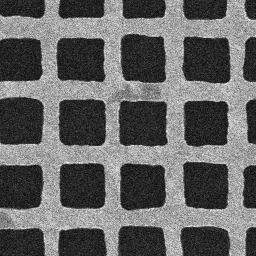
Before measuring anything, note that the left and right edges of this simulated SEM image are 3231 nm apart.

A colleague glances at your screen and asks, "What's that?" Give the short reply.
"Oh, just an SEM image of a regular array of holes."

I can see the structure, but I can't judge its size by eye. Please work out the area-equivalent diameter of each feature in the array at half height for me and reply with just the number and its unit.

0.64 micrometres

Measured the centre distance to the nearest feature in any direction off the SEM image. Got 785 nm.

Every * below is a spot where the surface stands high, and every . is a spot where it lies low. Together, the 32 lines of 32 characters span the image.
......*......**......**.....***.
......*......**......**.....***.
********************************
********************************
****************..**************
.....**......**......**......**.
.....**......**......**......**.
.....**......**......**......**.
.....**......**......**......*..
.....**......**......**......*..
********************************
********************************
.....***....********************
.....**......**......**.....***.
.....**......**......**......**.
.....**......**......**......**.
.....**......**......**.....***.
.....***.....**......**.....***.
********************************
********************************
********....***********.....****
.....**......**......**......*..
.....**......**......**......*..
.....**......**......**......*..
.....***.....**......**......*..
.....***.....**.....***.....**..
********************************
********************************
**********.****.....***.....***.
.....**......**......**......**.
......*......**......**......**.
......*......**......**......**.